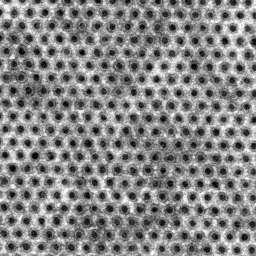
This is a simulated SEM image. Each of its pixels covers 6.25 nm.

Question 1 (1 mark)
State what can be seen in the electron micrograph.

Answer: a regular array of raised bodies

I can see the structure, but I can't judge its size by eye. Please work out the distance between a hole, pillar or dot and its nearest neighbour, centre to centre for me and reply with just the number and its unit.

92.5 nanometres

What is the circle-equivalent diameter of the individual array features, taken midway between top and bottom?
8.29 px